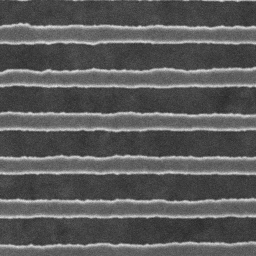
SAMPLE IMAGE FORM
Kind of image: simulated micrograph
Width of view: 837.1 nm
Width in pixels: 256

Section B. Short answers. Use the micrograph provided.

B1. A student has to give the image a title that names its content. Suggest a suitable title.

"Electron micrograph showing lines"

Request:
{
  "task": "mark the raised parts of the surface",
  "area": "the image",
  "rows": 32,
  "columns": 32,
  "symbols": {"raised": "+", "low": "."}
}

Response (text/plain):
................................
................................
................................
++++++++++++++++++++++++++++++++
++++++++++++++++++++++++++++++++
...........+....................
................................
................................
...............................+
++++++++++++++++++++++++++++++++
++++++++++++++++++++++++++++++++
................................
................................
................................
++++++++++++++++++++++++++++++++
++++++++++++++++++++++++++++++++
................................
................................
................................
.......+......++++..............
++++++++++++++++++++++++++++++++
++++++++++++++++++++++++++++++++
................................
................................
................................
++++++++++++++++++++++++++++++++
++++++++++++++++++++++++++++++++
................................
................................
................................
............++......++++++++++++
++++++++++++++++++++++++++++++++